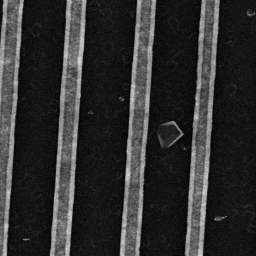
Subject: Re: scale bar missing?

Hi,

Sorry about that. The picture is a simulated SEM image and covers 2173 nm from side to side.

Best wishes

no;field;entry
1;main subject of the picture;one or a few lines or trenches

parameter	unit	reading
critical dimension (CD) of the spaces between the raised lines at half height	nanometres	428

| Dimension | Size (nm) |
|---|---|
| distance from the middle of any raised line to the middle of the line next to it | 564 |